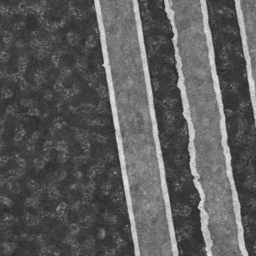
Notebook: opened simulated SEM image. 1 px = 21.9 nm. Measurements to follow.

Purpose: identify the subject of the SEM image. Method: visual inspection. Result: one or a few lines or trenches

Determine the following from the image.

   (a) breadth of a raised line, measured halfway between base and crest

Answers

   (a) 804 nanometres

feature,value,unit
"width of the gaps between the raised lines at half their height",748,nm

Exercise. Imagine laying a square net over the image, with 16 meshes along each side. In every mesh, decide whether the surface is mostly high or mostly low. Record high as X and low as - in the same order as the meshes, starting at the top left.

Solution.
------XXX-XXX--X
------XXX--XX--X
------XXX--XX--X
-------XX--XX--X
-------XX--XX---
-------XX--XXX--
-------XX---XX--
-------XXX--XX--
-------XXX--XX--
--------XX--XX--
--------XX--XX--
--------XX--XXX-
--------XX---XX-
--------XXX--XX-
--------XXX--XX-
---------XX--XX-